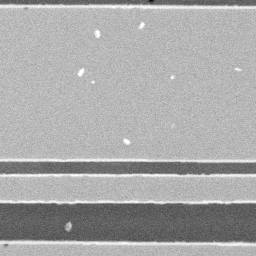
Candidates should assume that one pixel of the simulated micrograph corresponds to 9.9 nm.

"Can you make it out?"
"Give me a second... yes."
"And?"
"lines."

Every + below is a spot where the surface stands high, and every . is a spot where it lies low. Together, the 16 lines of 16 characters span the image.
++++++++++++++++
++++++++++++++++
++++++++++++++++
++++++++++++++++
++++++++++++++++
++++++++++++++++
++++++++++++++++
++++++++++++++++
++++++++++++++++
++++++++++++++++
++++++++++++++++
++++++++++++++++
++++++++++++++++
................
................
++++++++++++++++